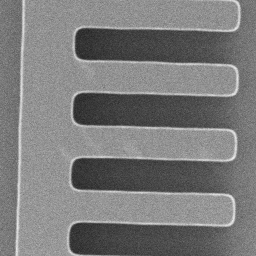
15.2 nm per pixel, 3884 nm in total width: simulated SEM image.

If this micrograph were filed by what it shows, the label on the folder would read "groups of lines, slits or small figures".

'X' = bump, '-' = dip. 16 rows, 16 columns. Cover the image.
-XXXXXXXXXXXXXX-
-XXXXXXXXXXXXXX-
-XXXX-----------
-XXXX-----------
-XXXXXXXXXXXXXX-
-XXXXXXXXXXXXXX-
-XXXX-----------
-XXXX-----------
-XXXXXXXXXXXXXX-
-XXXXXXXXXXXXXX-
-XXX------------
-XXXX-----------
-XXXXXXXXXXXXX--
-XXXXXXXXXXXXXX-
-XXX------------
-XXX------------